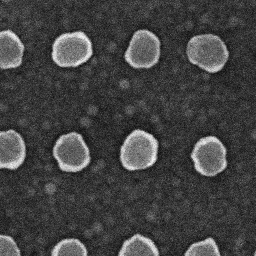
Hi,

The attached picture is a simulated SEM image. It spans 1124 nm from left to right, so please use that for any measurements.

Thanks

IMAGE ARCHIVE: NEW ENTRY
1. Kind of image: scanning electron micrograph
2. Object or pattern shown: raised bodies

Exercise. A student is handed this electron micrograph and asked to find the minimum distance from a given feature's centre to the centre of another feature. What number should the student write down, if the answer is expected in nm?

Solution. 296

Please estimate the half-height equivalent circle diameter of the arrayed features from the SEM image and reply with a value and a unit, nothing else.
36.2 px